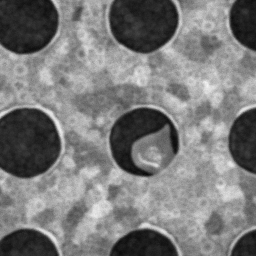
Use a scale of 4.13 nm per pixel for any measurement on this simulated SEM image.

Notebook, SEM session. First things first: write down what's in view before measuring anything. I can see holes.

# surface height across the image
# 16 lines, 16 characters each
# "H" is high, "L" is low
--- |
LLLLHHHLLLLHHHLL
LLLLHHHLLLLHHHLL
LLLHHHHLLLLHHHHL
HHHHHHHHHHHHHHHH
HHHHHHHHHHHHHHHH
HHHHHHHHHHHHHHHH
HHHHHHHHHHHHHHHH
LLLHHHHLLLLHHHHL
LLLLHHHLLLLHHHLL
LLLLHHHLHHHHHHLL
LLLHHHHHLHHHHHHL
HHHHHHHHHHHHHHHH
HHHHHHHHHHHHHHHH
HHHHHHHHHHHHHHHH
HLLHHHHHLLHHHHHH
LLLLHHHLLLLHHHHL